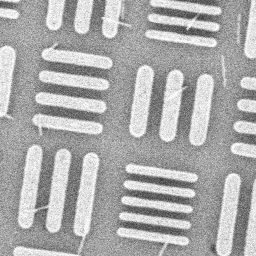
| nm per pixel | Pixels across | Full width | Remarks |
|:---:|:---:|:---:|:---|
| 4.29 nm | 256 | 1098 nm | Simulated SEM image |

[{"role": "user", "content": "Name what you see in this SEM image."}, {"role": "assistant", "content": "groups of lines, slits or small figures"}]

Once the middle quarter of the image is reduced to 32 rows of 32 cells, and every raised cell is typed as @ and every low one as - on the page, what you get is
-------@@@@@--------------------
-------------------@@@----------
-------------------@@@----@@@---
@@@@@@------------@@@@----@@@@--
@@@@@@@@@@@-------@@@@----@@@@--
----@@@@@@@-------@@@@----@@@@--
------------------@@@@----@@@@--
------------------@@@@---@@@@---
@@----------------@@@----@@@@---
@@@@@@@@@@--------@@@----@@@@---
@@@@@@@@@@-------@@@@----@@@@---
-----@@@@@-------@@@@----@@@@---
-----------------@@@@----@@@----
-----------------@@@@----@@@----
@@@@@------------@@@@---@@@@----
@@@@@@@@@--------@@@----@@@@----
--@@@@@@@--------@@@----@@@@----
-----------------@@@----@@@@----
------------------------@@@-----
--------------------------------
--------------------------------
--------------------------------
@-------------------------------
@----@@@------------------------
@----@@@------------------------
@----@@@--------@@--------------
@----@@@--------@@@@@@@@@-------
@----@@@------------@@@@@@@@@@@@
@---@@@@-------------------@@@@@
@---@@@@--------@@--------------
@---@@@--------@@@@@@@@@--------
----@@@-------------@@@@@@@@@@@-